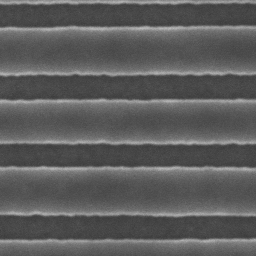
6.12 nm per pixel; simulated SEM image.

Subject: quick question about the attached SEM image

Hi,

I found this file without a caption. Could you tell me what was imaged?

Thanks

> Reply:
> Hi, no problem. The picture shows lines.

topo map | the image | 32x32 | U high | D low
DDDDDDDDDDDDDDDDDDDDDDDDDDDDDDDD
DDDDDDDDDDDDDDDDDDDDDDDDDDDDDDDD
DDDDDDDDDDDDDDDDDDDDDDDDDDDDDDDD
UUDDDDDUUUUUUUUUUUUUUUUUUUUUUUUU
UUUUUUUUUUUUUUUUUUUUUUUUUUUUUUUU
UUUUUUUUUUUUUUUUUUUUUUUUUUUUUUUU
UUUUUUUUUUUUUUUUUUUUUUUUUUUUUUUU
UUUUUUUUUUUUUUUUUUUUUUUUUUUUUUUU
UUUUUUUUUUUUUUUUUUUUUUUUUUUUUUUU
DDDDDDDDDDDDDDDDDDDDDDDDDDDDDDDD
DDDDDDDDDDDDDDDDDDDDDDDDDDDDDDDD
DDDDDDDDDDDDDDDDDDDDDDDDDDDDDDDD
DDDDDDDDDDDDUDDDDDDDDDDDDDDDDDUD
UUUUUUUUUUUUUUUUUUUUUUUUUUUUUUUU
UUUUUUUUUUUUUUUUUUUUUUUUUUUUUUUU
UUUUUUUUUUUUUUUUUUUUUUUUUUUUUUUU
UUUUUUUUUUUUUUUUUUUUUUUUUUUUUUUU
UUUUUUUUUUUUUUUUUUUUUUUUUUUUUUUU
DDDDDDDDDDDDDDDDDDDDDDDDDDDDDDDD
DDDDDDDDDDDDDDDDDDDDDDDDDDDDDDDD
DDDDDDDDDDDDDDDDDDDDDDDDDDDDDDDD
UUUUUUUUUUUUUUUUUUUUUUUUUUUUUUUU
UUUUUUUUUUUUUUUUUUUUUUUUUUUUUUUU
UUUUUUUUUUUUUUUUUUUUUUUUUUUUUUUU
UUUUUUUUUUUUUUUUUUUUUUUUUUUUUUUU
UUUUUUUUUUUUUUUUUUUUUUUUUUUUUUUU
UUUUUUUUUUUUUUUUUUUUUUUUUUUUUUUU
DDDDDDDDDDDDDDDDDDDDDDDDDDDDDDDD
DDDDDDDDDDDDDDDDDDDDDDDDDDDDDDDD
DDDDDDDDDDDDDDDDDDDDDDDDDDDDDDDD
UUUUUUUUUUUUUUUUUUUUUUUUUUUUUUUU
UUUUUUUUUUUUUUUUUUUUUUUUUUUUUUUU